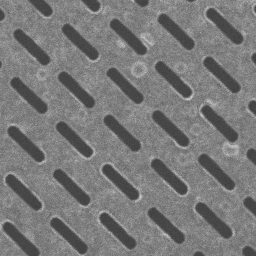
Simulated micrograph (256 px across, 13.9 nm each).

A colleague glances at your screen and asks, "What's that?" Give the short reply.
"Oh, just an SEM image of a regular array of holes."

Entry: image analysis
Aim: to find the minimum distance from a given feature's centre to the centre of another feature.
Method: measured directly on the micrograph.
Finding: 667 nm